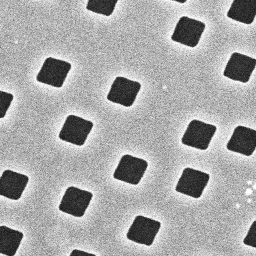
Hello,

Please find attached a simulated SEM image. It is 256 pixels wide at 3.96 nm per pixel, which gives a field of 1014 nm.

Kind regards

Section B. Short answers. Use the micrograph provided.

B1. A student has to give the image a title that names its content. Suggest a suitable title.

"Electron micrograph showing a regular array of holes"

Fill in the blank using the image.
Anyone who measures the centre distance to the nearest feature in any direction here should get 0.246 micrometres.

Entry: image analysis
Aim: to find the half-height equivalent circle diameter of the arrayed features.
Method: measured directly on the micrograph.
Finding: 120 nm